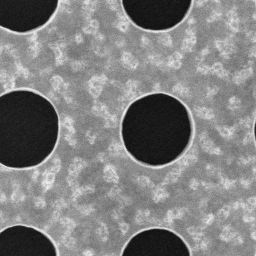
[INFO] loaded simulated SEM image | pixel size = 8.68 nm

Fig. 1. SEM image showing holes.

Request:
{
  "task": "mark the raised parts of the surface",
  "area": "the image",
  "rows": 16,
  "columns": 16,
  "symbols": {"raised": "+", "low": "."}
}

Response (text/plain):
....++++....++++
...+++++...+++++
++++++++++++++++
++++++++++++++++
++++++++++++++++
++++++++++++++++
...+++++...+++++
....++++....++++
....++++....++++
...+++++....++++
++++++++++++++++
++++++++++++++++
++++++++++++++++
++++++++++++++++
..+++++++..+++++
...+++++....++++